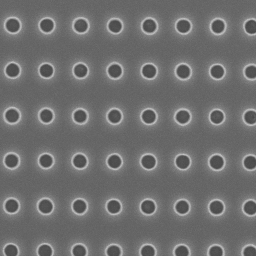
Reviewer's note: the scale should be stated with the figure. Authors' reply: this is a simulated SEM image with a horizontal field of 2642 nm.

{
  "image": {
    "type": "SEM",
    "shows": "a regular array of holes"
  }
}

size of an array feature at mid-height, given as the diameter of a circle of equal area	149	nanometers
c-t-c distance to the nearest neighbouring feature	350	nanometers